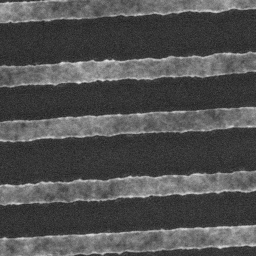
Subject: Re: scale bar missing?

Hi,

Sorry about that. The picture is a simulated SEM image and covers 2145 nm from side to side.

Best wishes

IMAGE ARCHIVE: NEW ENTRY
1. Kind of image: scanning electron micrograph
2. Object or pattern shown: lines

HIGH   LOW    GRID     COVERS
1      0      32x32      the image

11111111111111111111111111111111
11111111111111111111111000110000
11111100000000000000000000000000
00000000000000000000000000000000
00000000000000000000000000000000
00000000000000000000000000000000
00000000000000000000000000000000
00000000000000001111111111111111
11111111111111111111111111111111
11111111111111111111111111000000
11111010000000000000000000000000
00000000000000000000000000000000
00000000000000000000000000000000
00000000000000000000000000000000
00000000000001111111111111111111
11111111111111111111111111111111
11111111111111111111111000000000
11110000000000000000000000000000
00000000000000000000000000000000
00000000000000000000000000000000
00000000000000000000000000000000
00000000000000000000000000000011
00000000000000111111111111111111
11111111111111111111111111111111
11111111111111111110000000000000
10000000000000000000000000000000
00000000000000000000000000000000
00000000000000000000000000000000
00000000000000000000000000011111
00000001111111111111111111111111
11111111111111111111111111111111
11111111111111110000000000000000